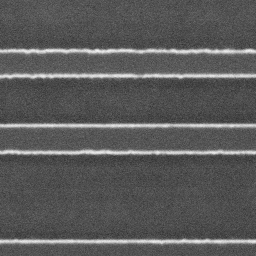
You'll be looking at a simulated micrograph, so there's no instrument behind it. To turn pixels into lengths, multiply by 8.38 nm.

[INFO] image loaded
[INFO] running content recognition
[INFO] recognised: lines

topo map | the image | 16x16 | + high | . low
................
................
................
++++++++++++++++
++++++++++++++++
................
................
................
++++++++++++++++
++++++++++++++++
................
................
................
................
................
++++++++++++++++